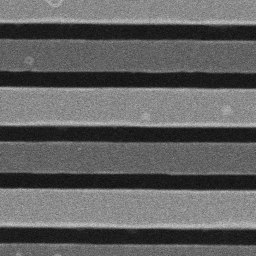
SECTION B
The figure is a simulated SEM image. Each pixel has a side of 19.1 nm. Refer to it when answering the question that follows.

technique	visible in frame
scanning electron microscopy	lines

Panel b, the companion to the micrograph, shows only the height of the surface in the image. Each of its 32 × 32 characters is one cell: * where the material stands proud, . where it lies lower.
********************************
********************************
********************************
................................
................................
********************************
********************************
********************************
********************************
................................
................................
********************************
********************************
********************************
********************************
********************************
................................
................................
********************************
********************************
********************************
********************************
................................
................................
********************************
********************************
********************************
********************************
............********************
................................
................................
********************************